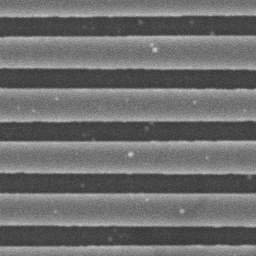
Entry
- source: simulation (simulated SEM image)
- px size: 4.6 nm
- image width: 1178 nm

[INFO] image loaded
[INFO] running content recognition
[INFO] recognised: lines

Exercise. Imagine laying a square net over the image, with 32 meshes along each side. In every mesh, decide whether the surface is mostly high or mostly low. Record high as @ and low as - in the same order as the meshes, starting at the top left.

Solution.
@@@@@@@@@@@@@@@@@@@@@@@@@@@@@@@@
@@@@@@@@@@@@@@@@@@@@@@@@@@@@@@@@
--------------------------------
--------------------------------
--------------------------------
@@@@@@@@@@@@@@@@@@@@@@@@@@@@@@@@
@@@@@@@@@@@@@@@@@@@@@@@@@@@@@@@@
@@@@@@@@@@@@@@@@@@@@@@@@@@@@@@@@
-----------@@@@@@-@@@@@@@@@@@@@@
--------------------------------
--------------------------------
@@@@@@@@@@@@@@@@@@@@@@@@@@@@@@@@
@@@@@@@@@@@@@@@@@@@@@@@@@@@@@@@@
@@@@@@@@@@@@@@@@@@@@@@@@@@@@@@@@
@@@@@@@@@@@@@@@@@@@@@@@@@@@@@@@@
--------------------------------
--------------------------------
--------------------------------
@@@@@@@@@@@@@@@@@@@@@@@@@@@@@@@@
@@@@@@@@@@@@@@@@@@@@@@@@@@@@@@@@
@@@@@@@@@@@@@@@@@@@@@@@@@@@@@@@@
@@-@@@@@@@@@@@@@@@@@@@@@@@@@@@@@
--------------------------------
--------------------------------
@@@@@@@@@@@@@@@@@@@@@@@@@@@@@@@@
@@@@@@@@@@@@@@@@@@@@@@@@@@@@@@@@
@@@@@@@@@@@@@@@@@@@@@@@@@@@@@@@@
@@@@@@@@@@@@@@@@@@@@@@@@@@@@@@@@
--------------------------------
--------------------------------
--------------------------------
@@@@@@@@@@@@@@@@@@@@@@@@@@@@@@@@